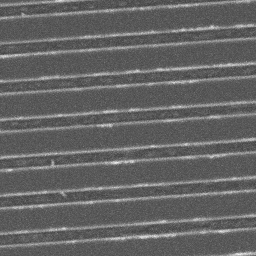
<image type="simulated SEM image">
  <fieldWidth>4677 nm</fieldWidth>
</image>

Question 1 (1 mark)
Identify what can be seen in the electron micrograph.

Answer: parallel lines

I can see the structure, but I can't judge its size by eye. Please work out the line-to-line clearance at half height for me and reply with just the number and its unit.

219 nm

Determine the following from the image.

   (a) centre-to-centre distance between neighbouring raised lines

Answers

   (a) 38 px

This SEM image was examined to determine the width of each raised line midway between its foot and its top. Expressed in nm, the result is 488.